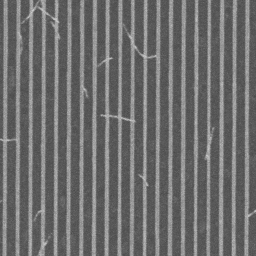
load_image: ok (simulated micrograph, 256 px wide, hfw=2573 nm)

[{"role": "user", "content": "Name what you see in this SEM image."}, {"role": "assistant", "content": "parallel lines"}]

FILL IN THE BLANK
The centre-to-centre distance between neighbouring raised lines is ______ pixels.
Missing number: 12.7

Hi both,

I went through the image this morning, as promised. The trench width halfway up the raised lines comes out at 98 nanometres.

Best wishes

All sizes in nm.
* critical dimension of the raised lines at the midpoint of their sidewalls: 30.1